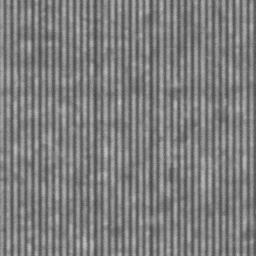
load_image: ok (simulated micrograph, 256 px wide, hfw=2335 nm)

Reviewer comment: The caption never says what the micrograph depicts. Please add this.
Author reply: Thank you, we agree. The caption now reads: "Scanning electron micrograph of parallel lines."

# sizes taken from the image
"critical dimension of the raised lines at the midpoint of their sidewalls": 28.5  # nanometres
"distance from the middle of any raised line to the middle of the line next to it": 63.3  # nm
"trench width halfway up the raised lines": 0.0353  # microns